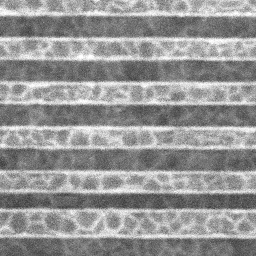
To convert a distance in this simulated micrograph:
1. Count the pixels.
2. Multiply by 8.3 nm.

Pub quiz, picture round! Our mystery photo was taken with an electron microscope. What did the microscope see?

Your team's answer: parallel lines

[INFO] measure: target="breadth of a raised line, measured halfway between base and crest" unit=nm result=166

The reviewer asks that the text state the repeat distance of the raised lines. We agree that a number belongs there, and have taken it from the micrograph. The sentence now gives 361 nm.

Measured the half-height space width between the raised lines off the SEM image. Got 0.198 um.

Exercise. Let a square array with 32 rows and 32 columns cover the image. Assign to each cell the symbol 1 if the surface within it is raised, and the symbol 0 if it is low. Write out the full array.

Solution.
11111111111111111111111111111111
11111111111111111111111111111111
00000000000000000000000000000000
00000000000000000000000000000000
00000000000000000000000000000000
11111111111111111111111111111111
11111111111111111111111111111111
00000000000000000000000000000000
00000000000000000000000000000000
00000000000000000000000000000000
11111100000000000011111110010011
11111111111111111111111111111111
11111111111111111111111111111111
00000000000000000000000000000000
00000000000000000000000000000000
00000000000000000000000000000000
11111111111111111111111111111111
11111111111111111111111111111111
00000000000000000000000000000000
00000000000000000000000000000000
00000000000000000000000000000000
01100110000000000000000000000000
11111111111111111111111111111111
11111111111111111111111111111111
00000000000000000000000000000000
00000000000000000000000000000000
11111111111111111111111111111111
11111111111111111111111111111111
11111111111111111111111111111111
10000111000000011111111000000111
00000000000000000000000000000000
00000000000000000000000000000000